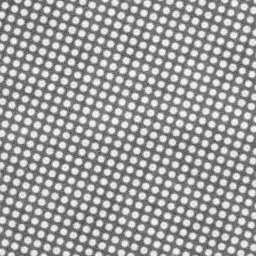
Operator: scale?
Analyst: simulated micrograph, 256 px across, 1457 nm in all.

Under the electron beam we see a regular array of raised bodies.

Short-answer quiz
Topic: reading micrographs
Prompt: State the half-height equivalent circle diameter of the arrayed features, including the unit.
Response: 35.7 nm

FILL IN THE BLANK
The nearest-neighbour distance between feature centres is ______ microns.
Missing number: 0.0568